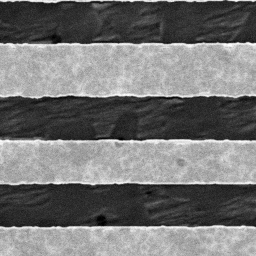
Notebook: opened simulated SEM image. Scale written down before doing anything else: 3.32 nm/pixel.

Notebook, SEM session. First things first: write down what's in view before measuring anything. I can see lines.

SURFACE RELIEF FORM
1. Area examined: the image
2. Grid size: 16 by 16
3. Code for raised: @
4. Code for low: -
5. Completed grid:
----------------
----------------
----------------
@@@@@@@@@@@@@@@@
@@@@@@@@@@@@@@@@
@@@@@@@@@@@@@@@@
----------------
----------------
----------------
@@@@@@@@@@@@@@@@
@@@@@@@@@@@@@@@@
@@--------------
----------------
----------------
@@@@@@@@@@@@@@@@
@@@@@@@@@@@@@@@@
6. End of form